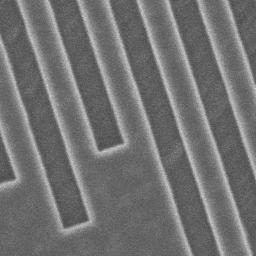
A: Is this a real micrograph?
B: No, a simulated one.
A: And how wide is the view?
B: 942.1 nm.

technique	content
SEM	parallel lines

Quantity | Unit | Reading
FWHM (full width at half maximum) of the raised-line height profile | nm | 103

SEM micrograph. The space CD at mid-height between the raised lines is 106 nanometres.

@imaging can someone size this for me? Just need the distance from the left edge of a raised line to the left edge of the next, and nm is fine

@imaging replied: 209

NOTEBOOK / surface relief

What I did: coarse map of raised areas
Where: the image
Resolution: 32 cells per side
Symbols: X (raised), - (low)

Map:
--XXXX----XXXX---XXXX----XXXX---
---XXX----XXXX----XXX----XXXX---
---XXXX----XXX----XXXX---XXXX---
---XXXX----XXXX---XXXX----XXXX--
----XXX----XXXX----XXX----XXXX--
----XXXX----XXX----XXXX----XXX--
X---XXXX----XXXX---XXXX----XXXX-
X----XXX----XXXX----XXX----XXXX-
X----XXXX----XXX----XXXX----XXX-
XX---XXXX----XXXX---XXXX----XXX-
XX----XXX----XXXX----XXX----XXXX
XX----XXXX----XXX----XXXX----XXX
XXX---XXXX----XXX----XXXX----XXX
XXX----XXX----XXXX----XXX----XXX
XXX----XXXX----XXX----XXXX---XXX
XXXX---XXXX----XXXX---XXXX----XX
XXXX----XXX----XXXX----XXX----XX
XXXX----XXXX---XXXX----XXXX---XX
-XXXX---XXXX--XXXXX----XXXX----X
-XXXX----XXXXXXXXXXX----XXX----X
-XXXX----XXXXXXXXXXX----XXXX---X
--XXXX---XXXXXXXXXXX----XXXX----
--XXXX----XXXXXXXXXXX----XXX----
XXXXXX----XXXXXXXXXXX----XXXX---
XXXXXXX---XXXXXXXXXXX----XXXX---
XXXXXXX----XXXXXXXXXXX----XXX---
XXXXXXX----XXXXXXXXXXX----XXXX--
XXXXXXXX---XXXXXXXXXXX----XXXX--
XXXXXXXX-XXXXXXXXXXXXXX----XXX--
XXXXXXXXXXXXXXXXXXXXXXX----XXXX-
XXXXXXXXXXXXXXXXXXXXXXX----XXXX-
XXXXXXXXXXXXXXXXXXXXXXXX----XXX-